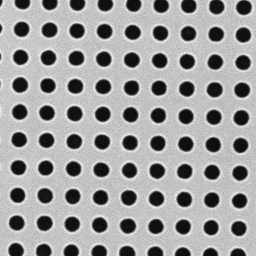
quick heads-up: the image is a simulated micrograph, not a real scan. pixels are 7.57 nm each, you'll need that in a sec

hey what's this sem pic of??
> a regular array of holes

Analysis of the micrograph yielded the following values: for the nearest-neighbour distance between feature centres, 208 nanometers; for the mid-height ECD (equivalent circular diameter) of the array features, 118 nm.